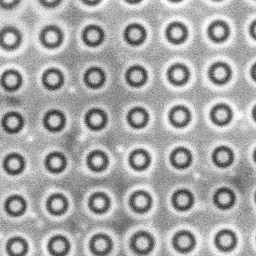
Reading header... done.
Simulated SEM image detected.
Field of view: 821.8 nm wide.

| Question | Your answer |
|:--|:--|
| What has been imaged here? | an array of small figures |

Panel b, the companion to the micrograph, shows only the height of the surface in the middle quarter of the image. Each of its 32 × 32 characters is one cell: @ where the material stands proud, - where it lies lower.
@@@@@@@--@@@@@@@----@@@@@@------
@@@@@-----@@@@@------@@@@-------
@@@@@------@@@@--@@--@@@@---@---
@@@@-------@@@@--@@--@@@@-------
@@@@@------@@@@------@@@@@------
@@@@@-----@@@@@@----@@@@@@-----@
@@@@@@@-@@@@@@@@@@@@@@@@@@@@@@@@
@@@@@@@@@@@@@@@@@@@@@@@@@@@@@@@@
@@@@@@@@@@@@@@@@@@@@@@@@@@@@@@@@
@@@@@@@@@@@@@@@@@@@@@@@@@@@@@@@@
@@@@@@@@@@@@@@@@@---@@@@@@@----@
@@@@@@----@@@@@@-----@@@@@------
@@@@@------@@@@@------@@@@--@---
-@@@@--@@--@@@@-------@@@@--@@--
-@@@@--@@--@@@@-------@@@@------
@@@@@------@@@@@-----@@@@@@-----
@@@@@@----@@@@@@@@-@@@@@@@@@--@@
@@@@@@@@@@@@@@@@@@@@@@@@@@@@@@@@
@@@@@@@@@@@@@@@@@@@@@@@@@@@@@@@@
@@@@@@@@@@@@@@@@@@@@@@@@@@@@@@@@
@@@@@@@@@@@@@@@@@@@@@@@@@@@@---@
@@@@@@@---@@@@@@@----@@@@@@-----
@@@@@@-----@@@@@------@@@@------
-@@@@-------@@@@--@---@@@@--@@--
-@@@@---@---@@@@--@---@@@@---@--
-@@@@------@@@@@------@@@@@-----
-@@@@@-----@@@@@@----@@@@@@@--@@
@@@@@@@@-@@@@@@@@@@@@@@@@@@@@@@@
@@@@@@@@@@@@@@@@@@@@@@@@@@@@@@@@
@@@@@@@@@@@@@@@@@@@@@@@@@@@@@@@@
@@@@@@@@@@@@@@@@@@@@@@@@@@@@@@@@
@@@@@@@@--@@@@@@@----@@@@@@@---@